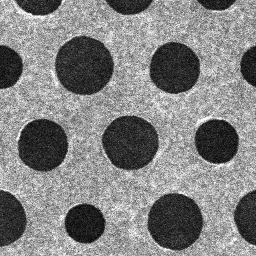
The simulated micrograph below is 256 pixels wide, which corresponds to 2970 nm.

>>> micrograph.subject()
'holes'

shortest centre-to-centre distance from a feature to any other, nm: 1020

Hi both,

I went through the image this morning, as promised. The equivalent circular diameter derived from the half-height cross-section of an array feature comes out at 52.3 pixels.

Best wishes